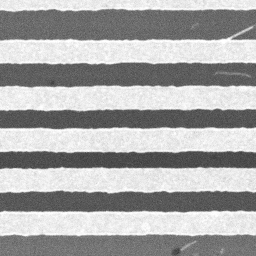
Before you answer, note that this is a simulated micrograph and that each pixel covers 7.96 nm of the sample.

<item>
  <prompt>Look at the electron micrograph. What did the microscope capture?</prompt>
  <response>lines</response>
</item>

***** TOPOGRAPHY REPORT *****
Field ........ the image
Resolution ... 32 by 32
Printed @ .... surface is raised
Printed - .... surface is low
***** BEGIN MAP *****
@@@@@@@@@@@@@@@@@@@@@@@@@@@@@@@@
--------------------------------
--------------------------------
--------------------------------
--------------------------------
@@@@@@@@@@@@@@@@@@@@@@@@@@@@@@@@
@@@@@@@@@@@@@@@@@@@@@@@@@@@@@@@@
@@@@@@@@@@@@@@@@@@@@@@@@@@@@@@@@
--------------------------------
--------------------------------
--------------------------------
@@@@@@@@@@@@@@@@@@@@@@@@@@@@@@@@
@@@@@@@@@@@@@@@@@@@@@@@@@@@@@@@@
@@@@@@@@@@@@@@@@@@@@@@@@@@@@@@@@
--------------------------------
--------------------------------
@@@@@@@@@@@@@@@@@@@@@@@@@@@@@@@@
@@@@@@@@@@@@@@@@@@@@@@@@@@@@@@@@
@@@@@@@@@@@@@@@@@@@@@@@@@@@@@@@@
--------------------------------
--------------------------------
@@@@@@@@@@@@@@@@@@@@@@@@@@@@@@@@
@@@@@@@@@@@@@@@@@@@@@@@@@@@@@@@@
@@@@@@@@@@@@@@@@@@@@@@@@@@@@@@@@
--------------------------------
--------------------------------
@-----------------@-------@@@@@-
@@@@@@@@@@@@@@@@@@@@@@@@@@@@@@@@
@@@@@@@@@@@@@@@@@@@@@@@@@@@@@@@@
--------------------------------
--------------------------------
--------------------------------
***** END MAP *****